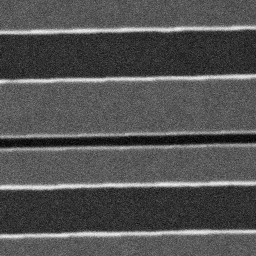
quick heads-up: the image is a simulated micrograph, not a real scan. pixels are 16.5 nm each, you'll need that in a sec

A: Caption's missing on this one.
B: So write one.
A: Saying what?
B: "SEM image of lines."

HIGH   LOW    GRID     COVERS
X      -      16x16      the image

XXXXXXXXXXXXXXXX
XXXXXXXXXXXXXXXX
----------------
----------------
----------------
XXXXXXXXXXXXXXXX
XXXXXXXXXXXXXXXX
XXXXXXXXXXXXXXXX
XXXXXXXXXXXXXXXX
XXXXXXXXXXXXXXXX
XXXXXXXXXXXXXXXX
XXXXXXXXXXXXX---
----------------
----------------
--------------XX
XXXXXXXXXXXXXXXX